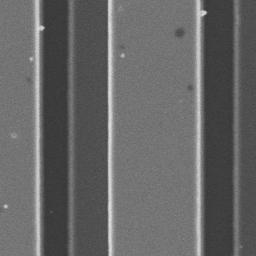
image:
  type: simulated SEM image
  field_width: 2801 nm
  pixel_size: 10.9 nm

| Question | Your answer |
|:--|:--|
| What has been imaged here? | lines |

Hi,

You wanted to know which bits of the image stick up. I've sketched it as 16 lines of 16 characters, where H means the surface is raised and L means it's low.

HHLLHHHHHHHHHLLH
HHHLHHHHHHHHHLLH
HHLLHHHHHHHHHLLH
HHLLHHHHHHHHHLLH
HHLLHHHHHHHHHLLH
HHLLHHHHHHHHHLLH
HHLLHHHHHHHHHLLH
HHLLHHHHHHHHHLLH
HHLLHHHHHHHHHLLH
HHLLHHHHHHHHHLLH
HHLLHHHHHHHHHLLH
HHLLHHHHHHHHHLLH
HHLLHHHHHHHHHLLH
HHLLHHHHHHHHHLLH
HHLLHHHHHHHHHLLH
HHLLHHHHHHHHHLLH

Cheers